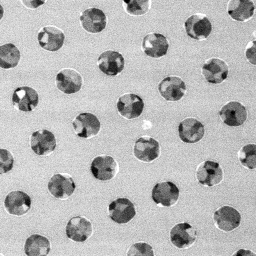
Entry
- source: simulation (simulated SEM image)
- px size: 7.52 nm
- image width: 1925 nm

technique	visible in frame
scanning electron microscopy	a regular array of raised bodies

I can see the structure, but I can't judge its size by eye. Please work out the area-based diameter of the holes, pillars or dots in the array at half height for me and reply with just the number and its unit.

27.3 pixels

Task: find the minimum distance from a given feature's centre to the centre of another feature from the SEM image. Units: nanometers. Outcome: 348